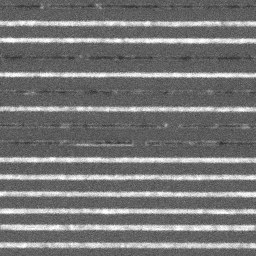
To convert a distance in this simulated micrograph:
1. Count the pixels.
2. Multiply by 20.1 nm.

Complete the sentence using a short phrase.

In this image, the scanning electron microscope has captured parallel lines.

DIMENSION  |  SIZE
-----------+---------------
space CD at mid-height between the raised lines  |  14 pixels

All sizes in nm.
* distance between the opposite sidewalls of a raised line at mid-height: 65.2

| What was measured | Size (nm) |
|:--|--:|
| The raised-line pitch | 342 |